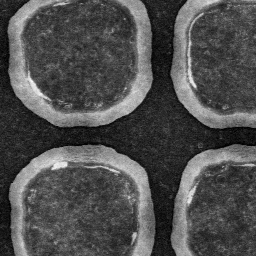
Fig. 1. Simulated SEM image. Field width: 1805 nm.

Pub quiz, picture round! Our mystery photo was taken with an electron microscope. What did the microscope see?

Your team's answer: raised bodies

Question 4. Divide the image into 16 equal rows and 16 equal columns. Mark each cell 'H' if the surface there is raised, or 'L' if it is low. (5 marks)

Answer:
LLHHHHHHLLLLHHHH
LHHHHHHHHLLHHHHH
LHHHHHHHHLLHHHHH
LHHHHHHHHLLHHHHH
LHHHHHHHHLLHHHHH
LHHHHHHHHLLHHHHH
LLHHHHHHLLLLHHHH
LLLLLLLLLLLLLHHL
LLLLLLLLLLLLLLLL
LLLLLLLLLLLLLLLL
LLHHHHHHLLLLHHHH
LHHHHHHHHLLLHHHH
LHHHHHHHHLLHHHHH
LHHHHHHHHLLHHHHH
LHHHHHHHHLLHHHHH
LHHHHHHHHLLHHHHH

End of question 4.